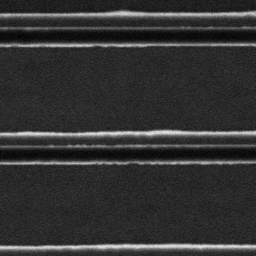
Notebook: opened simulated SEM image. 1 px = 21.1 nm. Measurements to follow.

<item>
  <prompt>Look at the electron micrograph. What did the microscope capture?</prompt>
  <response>lines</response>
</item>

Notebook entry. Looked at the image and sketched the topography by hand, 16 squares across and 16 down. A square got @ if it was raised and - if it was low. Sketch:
----------------
@@@@@@@@@@@@@@@@
@@@@@@@@@@@@@@@@
----------------
----------------
----------------
----------------
----------------
@@@@@@@@@@@@@@@@
@@@@@@@@@@@@@@@@
----------------
----------------
----------------
----------------
----------------
@@@@@@@@@@@@@@@@